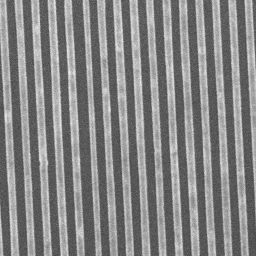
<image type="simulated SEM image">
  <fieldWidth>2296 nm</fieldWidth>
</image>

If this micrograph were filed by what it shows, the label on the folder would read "parallel lines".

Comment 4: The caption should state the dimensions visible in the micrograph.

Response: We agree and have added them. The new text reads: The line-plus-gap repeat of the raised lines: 147 nm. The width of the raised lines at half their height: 62.7 nm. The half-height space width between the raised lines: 0.0784 µm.